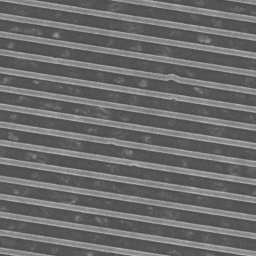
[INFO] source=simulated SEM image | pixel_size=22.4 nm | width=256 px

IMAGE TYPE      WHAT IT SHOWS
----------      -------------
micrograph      parallel lines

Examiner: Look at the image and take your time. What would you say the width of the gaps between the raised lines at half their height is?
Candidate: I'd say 272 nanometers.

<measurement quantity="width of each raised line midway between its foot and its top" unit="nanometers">125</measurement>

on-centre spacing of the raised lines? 400 nanometres